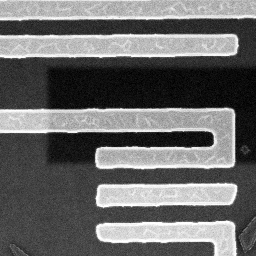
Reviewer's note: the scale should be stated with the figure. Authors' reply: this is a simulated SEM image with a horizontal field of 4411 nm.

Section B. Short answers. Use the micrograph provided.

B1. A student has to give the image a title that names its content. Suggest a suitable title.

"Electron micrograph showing wiring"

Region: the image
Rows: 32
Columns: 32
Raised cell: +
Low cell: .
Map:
++++++++++++++++++++++++++++++++
++++++++++++++++++++++++++++++++
................................
................................
....................+++++++++...
++++++++++++++++++++++++++++++..
+++++++++++++++++++++++++++++...
................................
................................
................................
................................
................................
................................
................................
+++++++++++++++++++++++++++++...
+++++++++++++++++++++++++++++...
+.........................+++...
...........................++...
.........................++++...
............+++++++++++++++++...
............+++++++++++++++++...
................................
................................
............+++++++++++++++++...
............+++++++++++++++++...
............++++++++++.+++++....
................................
................................
............+++++++++++++++++..+
............+++++++++++++++++.++
...........................++.++
..+........................++...